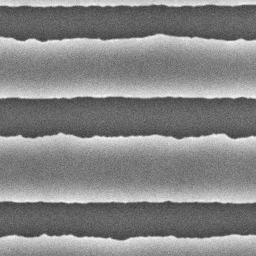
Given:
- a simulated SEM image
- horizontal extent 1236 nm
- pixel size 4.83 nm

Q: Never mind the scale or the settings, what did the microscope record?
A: lines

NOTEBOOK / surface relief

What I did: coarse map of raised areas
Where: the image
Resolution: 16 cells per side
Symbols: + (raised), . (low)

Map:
................
................
+...++++++++++..
++++++++++++++++
++++++++++++++++
++++++++++++++++
................
................
...++....+...+..
++++++++++++++++
++++++++++++++++
++++++++++++++++
++++++++++++++++
................
................
++++++++++++++++